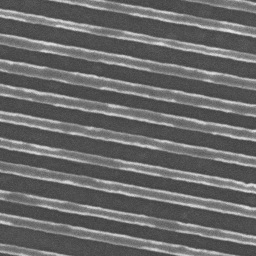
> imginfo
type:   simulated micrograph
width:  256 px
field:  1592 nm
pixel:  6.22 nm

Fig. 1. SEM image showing parallel lines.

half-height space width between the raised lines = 95.6 nm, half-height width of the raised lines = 59.7 nm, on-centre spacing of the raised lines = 158 nm